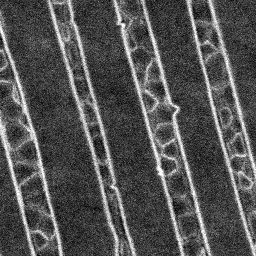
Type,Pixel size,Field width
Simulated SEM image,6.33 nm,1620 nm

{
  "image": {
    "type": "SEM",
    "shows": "one or a few lines or trenches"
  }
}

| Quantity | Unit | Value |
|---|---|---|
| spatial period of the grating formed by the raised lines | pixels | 68.2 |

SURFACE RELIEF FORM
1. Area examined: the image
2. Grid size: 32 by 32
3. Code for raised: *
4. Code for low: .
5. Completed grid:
******...*****....******..******
*******..******...******...*****
*******..******...******...*****
*******..******....*****...*****
*******...*****....******..*****
.*******..******...******...****
.*******..******....*****...****
.*******..******....*****...****
..*******..******...*****....***
..*******..******...******...***
..*******..******....*****...***
...******..******....*****...***
...*******..******...*****....**
...*******..******....*****...**
...*******..******....*****...**
....*******..******...*****...**
....*******..******...*****....*
*...*******..******...******...*
*....******..******....*****...*
*....*******..******...*****...*
*....*******..******...******...
**...*******..******...******...
**....*******.******....*****...
**....*******.*******...*****...
**....*******..******...******..
***...*******..******....*****..
***...*******..*******...*****..
***....*******..******...******.
***....*******..******...******.
****...*******..******....*****.
****...********.*******...*****.
****....*******..******...******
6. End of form